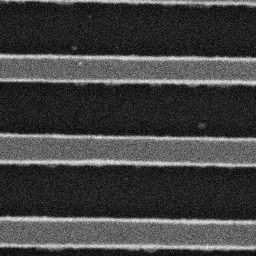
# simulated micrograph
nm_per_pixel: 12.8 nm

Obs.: lines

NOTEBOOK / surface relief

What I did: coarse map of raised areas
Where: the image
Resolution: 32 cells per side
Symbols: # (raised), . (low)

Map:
............................####
................................
................................
................................
................................
................................
................................
################################
################################
################################
................................
................................
................................
................................
................................
................................
................................
################################
################################
################################
.................###############
................................
................................
................................
................................
................................
................................
######################..........
################################
################################
################################
................................